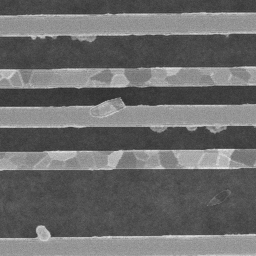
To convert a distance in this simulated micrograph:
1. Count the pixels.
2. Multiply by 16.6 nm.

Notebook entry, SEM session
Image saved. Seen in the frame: lines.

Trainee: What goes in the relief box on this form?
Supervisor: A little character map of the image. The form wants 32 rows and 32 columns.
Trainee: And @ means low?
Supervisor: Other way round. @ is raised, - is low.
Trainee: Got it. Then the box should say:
--------------------------------
--------------------------------
@@@@@@@@@@@@@@@@@@@@@@@@@@@@@@@@
@@@@@@@@@@@@@@@@@@@@@@@@@@@@@@@@
--------------------------------
--------------------------------
--------------------------------
--------------------------------
-----------------------------@@@
@@@@@@@@@@@@@@@@@@@@@@@@@@@@@@@@
@@@@@@@@@@@@@@@@@@@@@@@@@@@@@@@@
--------------------------------
--------------@-----------------
@@@@@@@@@@@@@@@@@@@@@@@@@@@@@@@@
@@@@@@@@@@@@@@@@@@@@@@@@@@@@@@@@
@@@@@@@@@@@@@@@@@@@@@@@@@@@@@@@@
--------------------------------
--------------------------------
--------------------------------
@@@@@@@@@@@@@@@@@@@@@@@@@@@@@@@@
@@@@@@@@@@@@@@@@@@@@@@@@@@@@@@@@
--------------------------------
--------------------------------
--------------------------------
--------------------------------
--------------------------------
--------------------------------
--------------------------------
-----@--------------------------
-----@@--------------@@@@@@@@@@@
@@@@@@@@@@@@@@@@@@@@@@@@@@@@@@@@
@@@@@@@@@@@@@@@@@@@@@@@@@@@@@@@@